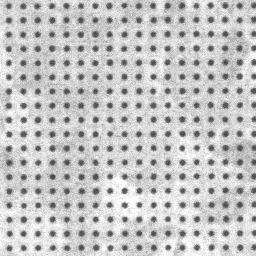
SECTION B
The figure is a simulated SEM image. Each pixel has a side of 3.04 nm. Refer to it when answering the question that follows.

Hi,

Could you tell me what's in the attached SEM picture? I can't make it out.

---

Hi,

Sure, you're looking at a regular array of holes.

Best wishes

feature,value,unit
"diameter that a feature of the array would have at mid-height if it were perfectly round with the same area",20.3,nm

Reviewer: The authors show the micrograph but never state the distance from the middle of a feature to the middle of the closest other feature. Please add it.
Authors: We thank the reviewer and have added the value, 42.5 nanometers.